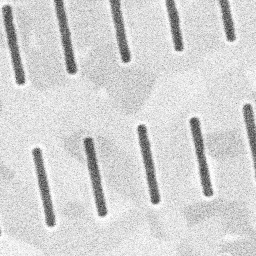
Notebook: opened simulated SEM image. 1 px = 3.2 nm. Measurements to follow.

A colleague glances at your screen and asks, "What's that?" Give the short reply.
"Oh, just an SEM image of holes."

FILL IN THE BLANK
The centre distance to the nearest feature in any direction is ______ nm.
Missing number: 169